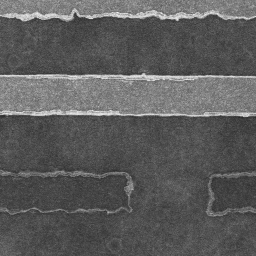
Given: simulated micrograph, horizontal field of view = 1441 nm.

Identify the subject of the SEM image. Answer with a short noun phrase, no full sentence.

one or a few lines or trenches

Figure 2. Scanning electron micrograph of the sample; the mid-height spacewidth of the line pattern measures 332 nanometres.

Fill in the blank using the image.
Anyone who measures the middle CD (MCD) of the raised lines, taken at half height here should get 38.4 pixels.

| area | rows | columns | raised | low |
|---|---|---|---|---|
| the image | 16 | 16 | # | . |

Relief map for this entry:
################
................
................
................
................
################
################
................
................
................
................
########.....###
########.....###
................
................
................